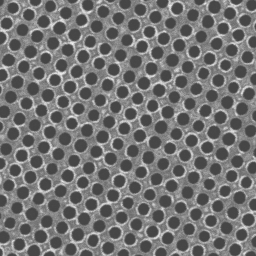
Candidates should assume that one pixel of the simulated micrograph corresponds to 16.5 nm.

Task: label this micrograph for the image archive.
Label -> a regular array of holes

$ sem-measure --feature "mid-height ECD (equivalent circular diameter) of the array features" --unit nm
207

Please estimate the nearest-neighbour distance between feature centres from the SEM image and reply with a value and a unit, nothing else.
0.267 micrometres